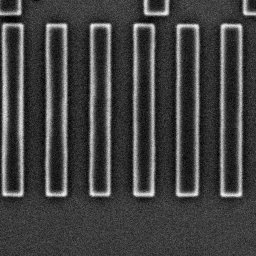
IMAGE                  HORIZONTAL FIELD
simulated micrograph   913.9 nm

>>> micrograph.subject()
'wiring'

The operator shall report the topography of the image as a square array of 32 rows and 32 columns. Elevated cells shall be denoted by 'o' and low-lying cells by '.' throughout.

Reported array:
ooo...............ooo..........o
ooo...............ooo..........o
................................
ooo...oo...ooo...oo...ooo...oo..
ooo...oo...ooo...oo...ooo...oo..
ooo...oo...ooo...oo...ooo...oo..
ooo...oo...ooo...oo...ooo...oo..
ooo...oo...ooo...oo...ooo...oo..
ooo...oo...ooo...oo...ooo...oo..
ooo...oo...ooo...oo...ooo...oo..
ooo...oo...ooo...oo...ooo...oo..
ooo...oo...ooo...oo...ooo...oo..
ooo...oo...ooo...oo...ooo...oo..
ooo...oo...ooo...oo...ooo...oo..
ooo...oo...ooo...oo...ooo...oo..
ooo...oo...ooo...oo...ooo...oo..
ooo...oo...ooo...oo...ooo...oo..
ooo...oo...ooo...oo...ooo...oo..
ooo...oo...ooo...oo...ooo...oo..
ooo...oo...ooo...oo...ooo...oo..
ooo...oo...ooo...oo...ooo...oo..
ooo...oo...ooo...oo...ooo...oo..
ooo...oo...ooo...oo...ooo...oo..
ooo...oo...ooo...oo...ooo...oo..
............................oo..
................................
................................
................................
................................
................................
................................
................................